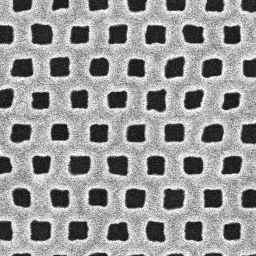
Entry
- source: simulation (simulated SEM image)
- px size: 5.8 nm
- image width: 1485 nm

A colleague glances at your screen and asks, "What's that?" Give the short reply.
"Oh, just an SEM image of a regular array of holes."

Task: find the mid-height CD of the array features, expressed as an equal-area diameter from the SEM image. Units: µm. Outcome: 0.118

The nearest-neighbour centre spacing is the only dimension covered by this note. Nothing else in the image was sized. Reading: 37.1 pixels